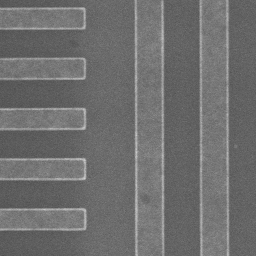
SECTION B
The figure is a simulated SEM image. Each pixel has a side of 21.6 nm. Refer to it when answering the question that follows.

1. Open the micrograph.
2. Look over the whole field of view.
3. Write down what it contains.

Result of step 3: groups of lines, slits or small figures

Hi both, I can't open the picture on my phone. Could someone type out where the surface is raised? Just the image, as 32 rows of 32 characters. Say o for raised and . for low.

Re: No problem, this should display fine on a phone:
.................ooo.....ooo....
ooooooooooo......ooo.....ooo....
ooooooooooo......ooo.....ooo....
oooooooooo.......ooo.....ooo....
.................ooo.....ooo....
.................ooo.....ooo....
.................ooo.....ooo....
oooooooooo.......ooo.....ooo....
ooooooooooo......ooo.....ooo....
oooooooooo.......ooo.....ooo....
.................ooo.....ooo....
.................ooo.....ooo....
.................ooo.....ooo....
.................ooo.....ooo....
ooooooooooo......ooo.....ooo....
ooooooooooo......ooo.....ooo....
.................ooo.....ooo....
.................ooo.....ooo....
.................ooo.....ooo....
.................ooo.....ooo....
ooooooooooo......ooo.....ooo....
ooooooooooo......ooo.....ooo....
.................ooo.....ooo....
.................ooo.....ooo....
.................ooo.....ooo....
.................ooo.....ooo....
ooooooooooo......ooo.....ooo....
ooooooooooo......ooo.....ooo....
oooooooooo.......ooo.....ooo....
.................ooo.....ooo....
.................ooo.....ooo....
.................ooo.....ooo....